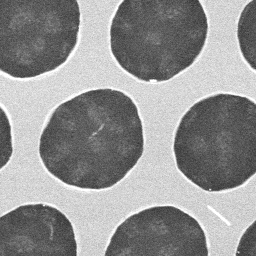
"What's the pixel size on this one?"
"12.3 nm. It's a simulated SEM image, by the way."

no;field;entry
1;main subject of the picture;holes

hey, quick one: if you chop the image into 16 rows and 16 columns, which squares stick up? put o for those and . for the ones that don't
.....oo......oo.
.....oo......oo.
.....oo......oo.
....ooo.....ooo.
...ooooo...ooooo
oooooooooooooooo
oooo....oooo....
.oo......oo.....
.oo......oo.....
.o.......oo.....
ooo.....ooo.....
oooo...ooooo...o
oooooooooooooooo
....oooo....oooo
.....oo......oo.
.....oo......oo.